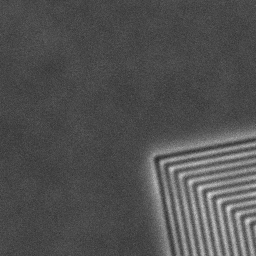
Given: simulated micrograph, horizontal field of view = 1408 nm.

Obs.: groups of lines, slits or small figures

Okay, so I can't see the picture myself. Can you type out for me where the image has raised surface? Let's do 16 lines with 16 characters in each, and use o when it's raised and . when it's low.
oooooooooooooooo
oooooooooooooooo
oooooooooooooooo
oooooooooooooooo
oooooooooooooooo
oooooooooooooooo
oooooooooooooooo
oooooooooooooooo
oooooooooooooooo
oooooooooooo....
oooooooooo......
oooooooooo......
oooooooooo......
oooooooooo......
ooooooooooo.....
ooooooooooo.....